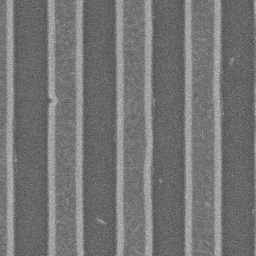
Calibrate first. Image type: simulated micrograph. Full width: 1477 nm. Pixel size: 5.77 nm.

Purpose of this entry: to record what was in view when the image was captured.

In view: one or a few lines or trenches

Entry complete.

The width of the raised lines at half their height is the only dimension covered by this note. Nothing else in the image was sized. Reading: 165 nm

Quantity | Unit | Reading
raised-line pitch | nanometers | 396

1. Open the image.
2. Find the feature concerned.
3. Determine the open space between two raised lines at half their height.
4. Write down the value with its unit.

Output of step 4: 235 nm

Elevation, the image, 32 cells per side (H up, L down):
HLLLLLHHHHLLLLLHHHLLLLLLHHHLLLLL
HLLLLLHHHHLLLLLHHHLLLLLLHHHLLLLL
HLLLLLHHHHLLLLLHHHHLLLLLHHHLLLLL
HLLLLLHHHHLLLLLHHHHLLLLLHHHLLLLL
HLLLLLHHHHLLLLLHHHHLLLLLHHHLLLLL
HLLLLLHHHHLLLLLHHHLLLLLLHHHLLLLL
HLLLLLHHHHLLLLLHHHLLLLLLHHHLLLLL
HLLLLLHHHHLLLLLHHHLLLLLLHHHLLLLL
HLLLLLHHHHLLLLLHHHLLLLLLHHHLLLLL
HLLLLLHHHHLLLLLHHHLLLLLLHHHLLLLL
HLLLLLHHHHLLLLLHHHLLLLLLHHHLLLLL
HLLLLLHHHHLLLLLHHHLLLLLLHHHLLLLL
HLLLLLLHHHLLLLLHHHLLLLLLHHHLLLLL
HLLLLLLHHHLLLLLHHHLLLLLLHHHLLLLL
HLLLLLHHHHLLLLLHHHLLLLLLHHHLLLLL
HLLLLLHHHHLLLLLHHHHLLLLLHHHLLLLL
HLLLLLHHHHLLLLLHHHHLLLLLHHHLLLLL
HLLLLLHHHHLLLLLHHHHLLLLLHHHLLLLL
HLLLLLHHHHLLLLLHHHHLLLLLHHHLLLLL
HLLLLLHHHHLLLLLHHHHLLLLLHHHLLLLL
HLLLLLHHHHLLLLLHHHLLLLLLHHHLLLLL
HLLLLLHHHHLLLLLHHHLLLLLLHHHLLLLL
HLLLLLHHHHLLLLLHHHLLLLLLHHHLLLLL
HLLLLLHHHHLLLLLHHHLLLLLLHHHLLLLL
HLLLLLLHHHLLLLLHHHLLLLLLHHHLLLLL
HLLLLLLHHHLLLLLHHHHLLLLLHHHLLLLL
HLLLLLLHHHLLLLLHHHHLLLLLHHHLLLLL
HLLLLLLHHHLLLLLHHHHLLLLLHHHLLLLL
HLLLLLLHHHLLLLLHHHHLLLLLHHHLLLLL
HLLLLLLHHHLLLLLHHHHLLLLLHHHLLLLL
HLLLLLHHHHLLLLLHHHHLLLLLHHHLLLLL
HLLLLLHHHHLLLLLHHHHLLLLLHHHLLLLL